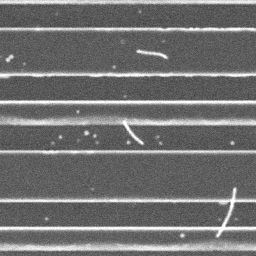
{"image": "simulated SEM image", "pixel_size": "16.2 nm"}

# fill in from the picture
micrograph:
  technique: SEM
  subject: lines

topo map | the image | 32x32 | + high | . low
................................
................................
................................
................................
++++++++++++++++++++++++++++++++
++++++++++++++++++++++++++++++++
++++++++++++++++++++++++++++++++
++++++++++++++++++++++++++++++++
++++++++++++++++++++++++++++++++
................................
................................
................................
................................
++++++++++++++++++++++++++++++++
++++++++++++++++++++++++++++++++
................................
................................
................................
................................
++++++++++++++++++++++++++++++++
++++++++++++++++++++++++++++++++
++++++++++++++++++++++++++++++++
++++++++++++++++++++++++++++++++
++++++++++++++++++++++++++++++++
++++++++++++++++++++++++++++++++
................................
................................
................................
+++++++++++++++++++++++..+++++++
++++++++++++++++++++++++++++++++
++++++++++++++++++++++++++++++++
................................